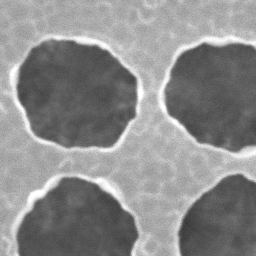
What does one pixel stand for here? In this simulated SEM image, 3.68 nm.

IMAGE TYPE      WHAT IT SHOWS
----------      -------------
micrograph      holes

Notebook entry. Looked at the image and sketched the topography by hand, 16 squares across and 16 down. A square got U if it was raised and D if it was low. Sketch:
UUUUUUUUUUUUUUUU
UUUUUUUUUUUUUUUU
UUUDUUUUUUUUUUUU
UUDDDDDUUUUDDDDD
UDDDDDDDUUUDDDDD
UDDDDDDDDUDDDDDD
UDDDDDDDDUDDDDDD
UUDDDDDDUUUDDDDD
UUDDDDDDUUUUDDDD
UUUUUUUUUUUUUUDU
UUUUUUUUUUUUUUUU
UUUDDDUUUUUUUDDD
UUDDDDDUUUUUDDDD
UUDDDDDDUUUDDDDD
UDDDDDDDDUUDDDDD
UDDDDDDDUUUDDDDD